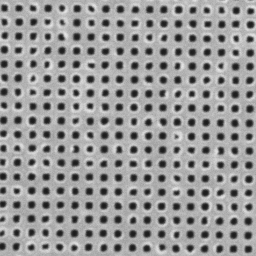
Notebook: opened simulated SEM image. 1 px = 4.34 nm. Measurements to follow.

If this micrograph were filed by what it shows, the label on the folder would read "a regular array of holes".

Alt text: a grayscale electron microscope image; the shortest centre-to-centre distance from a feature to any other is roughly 0.06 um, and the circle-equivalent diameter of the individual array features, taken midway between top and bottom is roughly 33.2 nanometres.